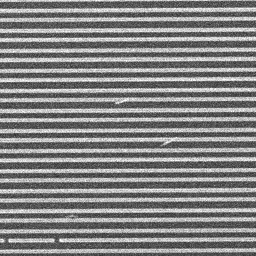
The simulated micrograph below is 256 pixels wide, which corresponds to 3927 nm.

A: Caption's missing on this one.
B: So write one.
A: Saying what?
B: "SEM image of parallel lines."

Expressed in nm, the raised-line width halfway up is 44.1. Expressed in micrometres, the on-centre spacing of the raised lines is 0.154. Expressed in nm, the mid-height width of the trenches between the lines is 115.